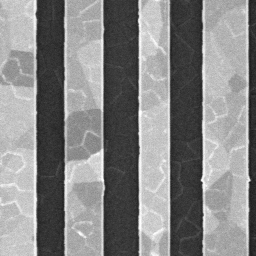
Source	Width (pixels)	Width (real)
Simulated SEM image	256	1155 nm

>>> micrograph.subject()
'one or a few lines or trenches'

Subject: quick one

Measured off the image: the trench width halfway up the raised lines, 154 nanometers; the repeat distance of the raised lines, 0.319 µm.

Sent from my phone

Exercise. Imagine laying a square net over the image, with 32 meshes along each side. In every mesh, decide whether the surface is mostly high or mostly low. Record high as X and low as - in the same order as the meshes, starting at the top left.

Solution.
XXXX----XXXXX-----XXX-----XXXXX-
XXXX----XXXXX-----XXX-----XXXXX-
XXXX----XXXXX----XXXX-----XXXXX-
XXXX----XXXXX-----XXX-----XXXXX-
XXXX----XXXXX----XXXX-----XXXXX-
XXXX----XXXXX----XXXX-----XXXXX-
XXXX----XXXXX----XXXX-----XXXXX-
XXXX----XXXXX-----XXX----XXXXXX-
XXXX----XXXXX-----XXX-----XXXXX-
XXXX----XXXXX-----XXX-----XXXXX-
XXXX----XXXXX-----XXX-----XXXXX-
XXXX----XXXXX-----XXX----XXXXXX-
XXXX----XXXXX-----XXX----XXXXXX-
XXXX----XXXXX----XXXX----XXXXXX-
XXXX----XXXXX----XXXX----XXXXXX-
XXXX----XXXXX----XXXX-----XXXXX-
XXXX----XXXXX----XXXX----XXXXXX-
XXXX----XXXXX-----XXX-----XXXXX-
XXXX----XXXXX-----XXX-----XXXXX-
XXXX----XXXXX-----XXX-----XXXXX-
XXXX----XXXXX----XXXX-----XXXXX-
XXXX----XXXXX----XXXX-----XXXXX-
XXXX----XXXXX----XXXX----XXXXXX-
XXXX----XXXXX----XXXX----XXXXXX-
XXXX----XXXXX----XXXX----XXXXXX-
XXXX----XXXXX-----XXX-----XXXXX-
XXXX----XXXXX----XXXX-----XXXXX-
XXXX----XXXXX-----XXX-----XXXXX-
XXXX----XXXXX-----XXX-----XXXXX-
XXXX----XXXXX-----XXX-----XXXXX-
XXXX----XXXXX-----XXX-----XXXXX-
XXXX----XXXXX-----XXX----XXXXXX-